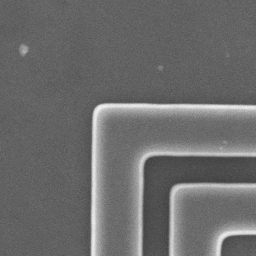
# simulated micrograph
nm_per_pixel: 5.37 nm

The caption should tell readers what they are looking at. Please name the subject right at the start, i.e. groups of lines, slits or small figures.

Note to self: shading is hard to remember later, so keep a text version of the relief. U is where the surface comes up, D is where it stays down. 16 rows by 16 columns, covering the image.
DDDDDDDDDDDDDDDD
DDDDDDDDDDDDDDDD
DDDDDDDDDDDDDDDD
DDDDDDDDDDDDDDDD
DDDDDDDDDDDDDDDD
DDDDDDDDDDDDDDDD
DDDDDDDDDDDDDDDD
DDDDDDUUUUUUUUUU
DDDDDDUUUUUUUUUU
DDDDDDUUUUUUUUUU
DDDDDDUUUDDDDDDD
DDDDDDUUUDDDDDDD
DDDDDDUUUDDUUUUU
DDDDDDUUUDDUUUUU
DDDDDDUUUDDUUUUU
DDDDDDUUUDDUUUDD